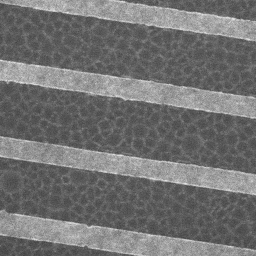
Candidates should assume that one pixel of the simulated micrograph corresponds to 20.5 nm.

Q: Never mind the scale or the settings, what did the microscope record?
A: one or a few lines or trenches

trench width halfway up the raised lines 55.4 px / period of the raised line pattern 1550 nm